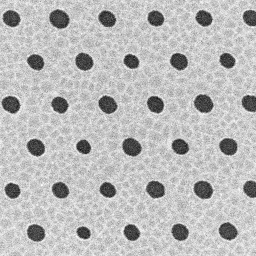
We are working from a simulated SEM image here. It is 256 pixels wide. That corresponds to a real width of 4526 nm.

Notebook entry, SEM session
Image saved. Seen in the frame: a regular array of holes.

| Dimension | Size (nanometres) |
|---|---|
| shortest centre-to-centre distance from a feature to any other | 845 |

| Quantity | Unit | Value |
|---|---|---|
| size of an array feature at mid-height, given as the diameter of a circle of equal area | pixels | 18.4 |